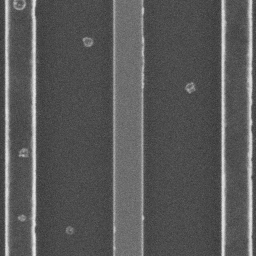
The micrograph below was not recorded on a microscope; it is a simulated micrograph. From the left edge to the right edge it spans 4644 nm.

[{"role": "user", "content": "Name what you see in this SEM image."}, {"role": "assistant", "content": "lines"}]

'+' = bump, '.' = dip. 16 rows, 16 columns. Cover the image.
++.....++.....++
++.....++.....++
++.....++.....++
++.....++.....++
++.....++.....++
++.....++.....++
++.....++.....++
++.....++.....++
++.....++.....++
++.....++.....++
++.....++.....++
++.....++.....++
++.....++.....++
++.....++.....++
++.....++.....++
++.....++.....++